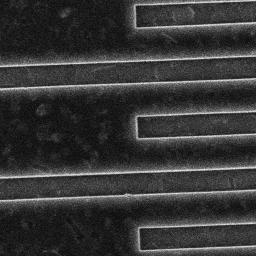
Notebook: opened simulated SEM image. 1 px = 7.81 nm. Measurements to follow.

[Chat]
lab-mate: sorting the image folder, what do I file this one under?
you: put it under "parallel lines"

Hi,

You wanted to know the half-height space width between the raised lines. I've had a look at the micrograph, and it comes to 175 nanometers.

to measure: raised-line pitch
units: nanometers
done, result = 435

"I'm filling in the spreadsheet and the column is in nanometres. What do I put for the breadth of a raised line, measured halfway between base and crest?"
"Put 258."